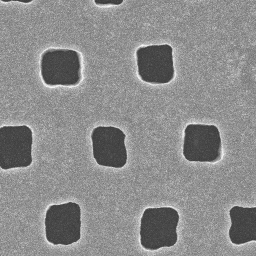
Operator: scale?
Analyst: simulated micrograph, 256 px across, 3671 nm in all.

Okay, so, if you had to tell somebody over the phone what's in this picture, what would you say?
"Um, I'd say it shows holes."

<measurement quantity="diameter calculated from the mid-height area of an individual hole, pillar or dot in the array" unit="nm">582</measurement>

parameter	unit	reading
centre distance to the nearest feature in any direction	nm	1310